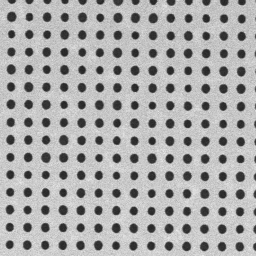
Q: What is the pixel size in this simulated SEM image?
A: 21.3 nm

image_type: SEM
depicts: a regular array of holes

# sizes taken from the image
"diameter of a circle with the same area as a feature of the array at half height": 188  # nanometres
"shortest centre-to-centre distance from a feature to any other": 0.369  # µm